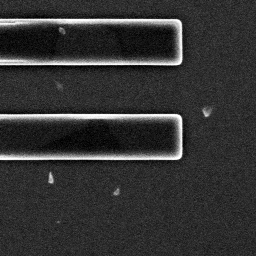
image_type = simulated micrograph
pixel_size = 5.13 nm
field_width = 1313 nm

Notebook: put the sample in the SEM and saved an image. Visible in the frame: wiring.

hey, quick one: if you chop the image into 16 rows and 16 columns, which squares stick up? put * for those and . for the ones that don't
................
***********.....
***********.....
***********.....
................
................
................
***********.....
***********.....
***********.....
................
................
................
................
................
................